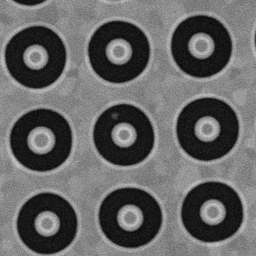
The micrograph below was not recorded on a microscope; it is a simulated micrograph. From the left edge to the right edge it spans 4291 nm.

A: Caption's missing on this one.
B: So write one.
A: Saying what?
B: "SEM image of an array of small figures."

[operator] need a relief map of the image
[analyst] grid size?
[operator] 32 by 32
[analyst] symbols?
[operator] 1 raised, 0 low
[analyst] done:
11000111111111111111111111111111
11111111111111111111111111111111
11111111111111001111111000001111
11100011111100000011110000001111
10000000111000000011100000000111
10000000111000110001100011000111
00001000111000110001100011000111
00011100111000110001110000000111
10000000111000000011110000001111
10000000111100000011111100011111
11000001111111001111111111111111
11111111111111111111111111111111
11111111111111111111111100001111
11110011111110000011111000000111
11000000111100000001110000000011
11000000011100000001110001100011
10001100011000111001110001100011
10001110011000010001110000000011
10001100011100000001111000000111
11000000011100000001111000001111
11000000111111000111111111111111
11110011111111111111111111111111
11111111111111111111111111111111
11111111111111000011111100000111
11110000111110000001111000000011
11100000011100000000111000100011
11000000001100011000110001110001
11000110001100011100111000100001
11000110001100000000111000000011
11000000001110000000111100000111
11100000011111000001111111111111
11110000111111111111111111111111